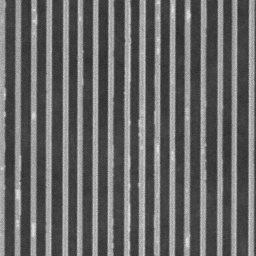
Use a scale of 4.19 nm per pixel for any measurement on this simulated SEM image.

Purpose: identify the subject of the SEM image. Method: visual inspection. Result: parallel lines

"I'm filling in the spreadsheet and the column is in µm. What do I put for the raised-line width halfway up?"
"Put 0.0204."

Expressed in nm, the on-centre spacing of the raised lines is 65.3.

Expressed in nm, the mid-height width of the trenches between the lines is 45.6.